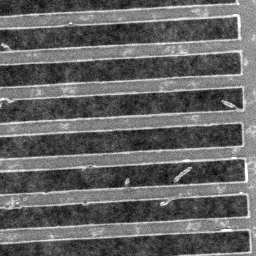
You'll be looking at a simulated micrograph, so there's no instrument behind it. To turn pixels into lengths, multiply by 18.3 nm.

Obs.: parallel lines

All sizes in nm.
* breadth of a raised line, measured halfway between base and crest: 425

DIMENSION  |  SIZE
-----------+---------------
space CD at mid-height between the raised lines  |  222 nanometres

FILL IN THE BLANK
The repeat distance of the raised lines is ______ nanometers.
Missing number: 651